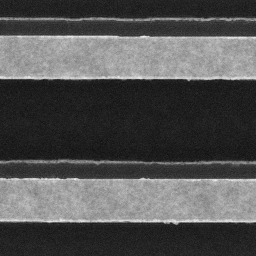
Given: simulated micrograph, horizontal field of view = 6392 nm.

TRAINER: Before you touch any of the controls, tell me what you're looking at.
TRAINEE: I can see lines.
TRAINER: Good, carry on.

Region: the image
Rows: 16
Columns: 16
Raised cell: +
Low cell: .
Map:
................
++++++++++++++++
++++++++++++++++
++++++++++++++++
++++++++++++++++
................
................
................
................
................
++++++++++++++++
++++++++++++++++
++++++++++++++++
++++++++++++++++
................
................